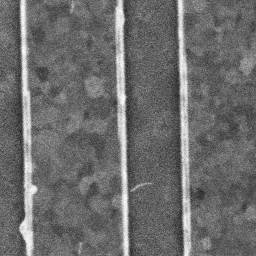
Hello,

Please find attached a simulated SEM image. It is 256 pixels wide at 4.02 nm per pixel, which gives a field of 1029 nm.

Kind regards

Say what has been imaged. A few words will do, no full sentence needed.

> one or a few lines or trenches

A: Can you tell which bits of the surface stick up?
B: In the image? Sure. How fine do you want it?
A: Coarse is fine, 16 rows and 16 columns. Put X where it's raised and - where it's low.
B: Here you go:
-XXXXXXX---XXXXX
-XXXXXXX---XXXXX
-XXXXXXX---XXXXX
--XXXXXX---XXXXX
--XXXXXX---XXXXX
--XXXXXX---XXXXX
-XXXXXXX---XXXXX
--XXXXXX---XXXXX
--XXXXXX---XXXXX
--XXXXXX---XXXXX
--XXXXXX---XXXXX
--XXXXXX----XXXX
--XXXXXX----XXXX
--XXXXXX----XXXX
-XXXXXXX----XXXX
--XXXXXX----XXXX